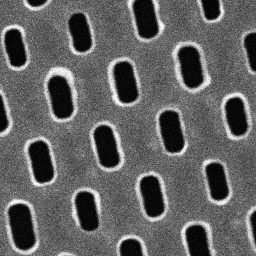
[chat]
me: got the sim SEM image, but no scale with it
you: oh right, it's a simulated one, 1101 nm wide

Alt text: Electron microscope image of a regular array of holes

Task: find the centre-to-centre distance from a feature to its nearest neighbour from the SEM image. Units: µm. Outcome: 0.287